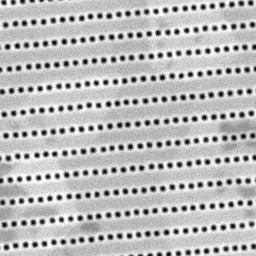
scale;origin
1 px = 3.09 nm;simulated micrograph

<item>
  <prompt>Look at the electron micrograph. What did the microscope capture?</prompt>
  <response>a regular array of holes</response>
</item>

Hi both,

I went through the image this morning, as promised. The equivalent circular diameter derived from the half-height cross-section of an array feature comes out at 20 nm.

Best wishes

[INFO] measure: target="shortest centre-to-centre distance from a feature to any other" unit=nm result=28.6